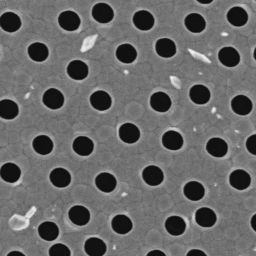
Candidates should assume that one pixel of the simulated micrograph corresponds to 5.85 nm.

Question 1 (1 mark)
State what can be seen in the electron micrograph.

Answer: a regular array of holes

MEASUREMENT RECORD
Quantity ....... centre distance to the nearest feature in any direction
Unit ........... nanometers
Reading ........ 224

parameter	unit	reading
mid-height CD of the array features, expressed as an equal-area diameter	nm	120